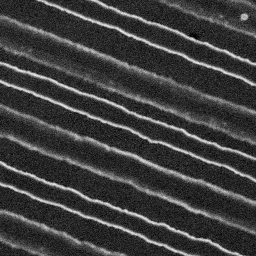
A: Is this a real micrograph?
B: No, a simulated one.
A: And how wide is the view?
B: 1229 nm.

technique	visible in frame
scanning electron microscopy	lines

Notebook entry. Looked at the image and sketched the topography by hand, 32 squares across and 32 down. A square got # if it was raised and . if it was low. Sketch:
......#######........##########.
.........######.........########
#..........#######.........#####
####..........#######.........##
#######.........#######.........
#########..........#######......
..##########.........#######....
.....#########..........#######.
##......########..........######
#####.....#########..........###
########.....#########.........#
...#######.....#########........
......#######.....#########.....
#.......#######.....##########..
###........#######.....#########
#####.........#######.....######
########.........######......###
..#########.......#######......#
....##########........######....
.......##########.......#######.
#.........#########........#####
###.........##########.......###
#####..........#########........
.#######.........##########.....
....#######.........##########..
......#######.........##########
.........#######.........#######
###.........#######.........####
######.........######.........##
########.........#######........
.##########........########.....
.....########.........#######...